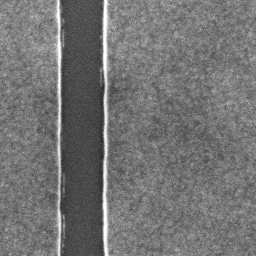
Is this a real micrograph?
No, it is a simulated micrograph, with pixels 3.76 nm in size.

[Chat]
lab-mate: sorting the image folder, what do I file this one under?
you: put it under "one or a few lines or trenches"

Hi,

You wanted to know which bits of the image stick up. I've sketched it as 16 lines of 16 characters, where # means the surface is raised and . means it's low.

####...#########
####...#########
####...#########
####...#########
####...#########
####...#########
####...#########
####...#########
####...#########
####...#########
####...#########
####...#########
####...#########
####...#########
####...#########
####...#########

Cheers